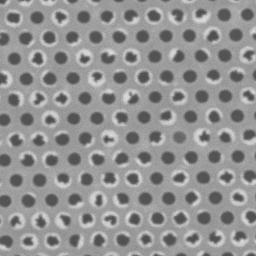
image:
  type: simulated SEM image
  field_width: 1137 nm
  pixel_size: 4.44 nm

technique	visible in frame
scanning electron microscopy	a regular array of holes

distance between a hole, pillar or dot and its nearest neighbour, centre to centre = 101 nm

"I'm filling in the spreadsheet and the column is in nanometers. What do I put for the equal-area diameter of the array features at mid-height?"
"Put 54.4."